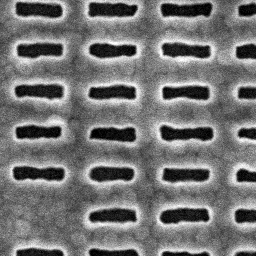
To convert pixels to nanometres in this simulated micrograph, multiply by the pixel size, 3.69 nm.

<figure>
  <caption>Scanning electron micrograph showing a regular array of holes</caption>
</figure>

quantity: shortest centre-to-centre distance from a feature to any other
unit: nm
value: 151